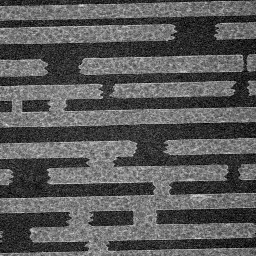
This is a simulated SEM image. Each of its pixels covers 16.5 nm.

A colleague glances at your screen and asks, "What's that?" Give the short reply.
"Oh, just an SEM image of parallel lines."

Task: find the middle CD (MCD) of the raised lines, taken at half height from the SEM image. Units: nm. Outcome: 239